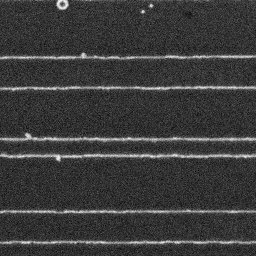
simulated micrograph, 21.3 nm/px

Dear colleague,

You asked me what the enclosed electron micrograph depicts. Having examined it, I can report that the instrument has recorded lines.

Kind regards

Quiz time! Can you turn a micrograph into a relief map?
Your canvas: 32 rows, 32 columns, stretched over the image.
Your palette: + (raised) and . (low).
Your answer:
.......+........................
................................
................................
................................
................................
................................
................................
++++++++++++++++++++++++++++++++
++++++++++++++++++++++++++++++++
++++++++++++++++++++++++++++++++
++++++++++++++++++++++++++++++++
................................
................................
................................
................................
................................
................................
++++++++++++++++++++++++++++++++
++++++++++++++++++++++++++++++++
.++....+++.........+..++++......
................................
................................
................................
................................
................................
................................
+++++++.++++++++++++++++++++++++
++++++++++++++++++++++++++++++++
++++++++++++++++++++++++++++++++
++++++++++++++++++++++++++++++++
................................
................................